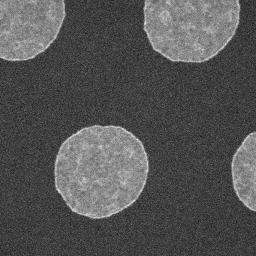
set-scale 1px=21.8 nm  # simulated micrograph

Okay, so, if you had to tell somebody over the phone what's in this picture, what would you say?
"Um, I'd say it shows raised bodies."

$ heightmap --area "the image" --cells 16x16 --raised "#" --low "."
####.....######.
####.....######.
###......#####..
##........###...
................
................
................
................
.....###........
....#####......#
...######......#
....#####......#
....####.......#
......#.........
................
................